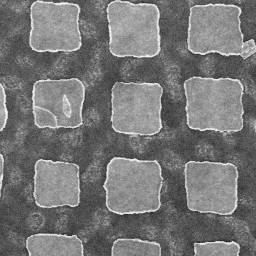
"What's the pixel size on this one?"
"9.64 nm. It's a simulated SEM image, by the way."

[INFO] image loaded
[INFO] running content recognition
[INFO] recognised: raised bodies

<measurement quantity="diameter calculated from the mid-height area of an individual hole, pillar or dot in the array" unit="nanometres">542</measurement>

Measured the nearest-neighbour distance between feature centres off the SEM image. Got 751 nm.